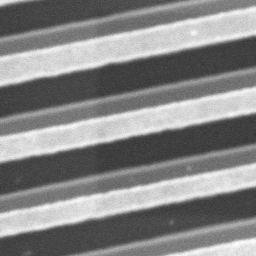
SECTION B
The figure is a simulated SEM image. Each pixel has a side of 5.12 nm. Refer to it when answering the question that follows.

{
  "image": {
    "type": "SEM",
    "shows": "lines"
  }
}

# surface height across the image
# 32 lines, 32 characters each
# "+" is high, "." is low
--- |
.......................+++++++++
.................+++++++++++++++
.............+++++++++++++++++++
.......+++++++++++++++++++++++++
..+++++++++++++++++++++++++++++.
+++++++++++++++++++++++++.......
+++++++++++++++++++++...........
++++++++++++++++................
+++++++++++.....................
++++++......................++++
+.....................++++++++++
..................++++++++++++++
............++++++++++++++++++++
........++++++++++++++++++++++++
..+++++++++++++++++++++++++++...
++++++++++++++++++++++++........
+++++++++++++++++++.............
++++++++++++++..................
+++++++++......................+
+++......................+++++++
....................++++++++++++
...............+++++++++++++++++
..........++++++++++++++++++++++
.....++++++++++++++++++++++++++.
+++++++++++++++++++++++++.......
++++++++++++++++++++............
+++++++++++++++.................
++++++++++......................
+++++......................+++++
......................++++++++++
.................+++++++++++++++
............++++++++++++++++++++